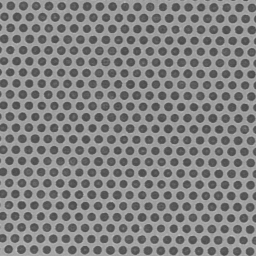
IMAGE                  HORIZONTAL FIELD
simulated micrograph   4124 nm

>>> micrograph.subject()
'a regular array of holes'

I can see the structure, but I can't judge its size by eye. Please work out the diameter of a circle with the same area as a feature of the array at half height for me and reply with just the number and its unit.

0.144 µm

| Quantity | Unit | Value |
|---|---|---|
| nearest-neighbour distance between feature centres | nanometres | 199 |